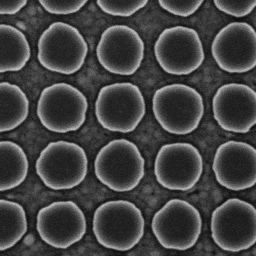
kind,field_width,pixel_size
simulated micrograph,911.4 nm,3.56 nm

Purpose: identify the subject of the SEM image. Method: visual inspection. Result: a regular array of raised bodies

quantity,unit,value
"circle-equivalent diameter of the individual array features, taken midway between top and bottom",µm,0.174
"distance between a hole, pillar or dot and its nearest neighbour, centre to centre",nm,205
